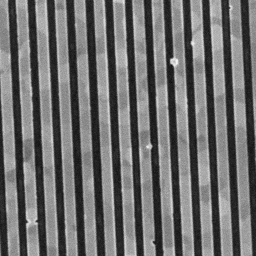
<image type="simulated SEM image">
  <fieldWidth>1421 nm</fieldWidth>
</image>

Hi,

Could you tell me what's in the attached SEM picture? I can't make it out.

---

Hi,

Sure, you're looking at parallel lines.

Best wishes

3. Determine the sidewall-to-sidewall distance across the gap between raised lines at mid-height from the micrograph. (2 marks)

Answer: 47.9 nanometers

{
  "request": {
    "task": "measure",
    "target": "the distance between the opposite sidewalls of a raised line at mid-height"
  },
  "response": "57.6 nanometers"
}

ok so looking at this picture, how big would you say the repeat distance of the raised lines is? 108 nm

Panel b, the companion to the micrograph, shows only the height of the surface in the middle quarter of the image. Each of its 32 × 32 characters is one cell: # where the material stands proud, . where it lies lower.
#..###..###..###..###..##..###..
#...##..###..###..###..##...##..
#...##..###..###..###..##...##..
#...##..###..###..###..##...##..
#...##..###..###..###..##...##..
#...##..###..###..###..###..##..
#...##...##..###..###..###..##..
#...##...##...##..###..###..##..
#...##...##...##..###..###..##..
##..##...##...##..###..###..##..
##..##...##...##..###..###..##..
##..##...##...##..###..###..###.
##..##...##...##...##..###..###.
##..##...##...##...##...##..###.
##..###..##...##...##...##..###.
##..###..##...##...##...##..###.
##..###..##...##...##...##..###.
##..###..##...##...##...##..###.
##..###..##...##...##...##..###.
##..###..##...##...##...##...##.
##..###..###..###..###..##...##.
##..###..###..###..###..##...##.
##...##..###..###..###..##...##.
##...##..###..###..###..##...##.
##...##..###..###..###..##...##.
##...##..###..###..###..##...##.
##...##..###..###..###..##...##.
##...##..###..###..###..###..##.
##...##...##...##..###..###..##.
##...##...##...##...##..###..##.
###..##...##...##...##..###..##.
###..##...##...##...##..###..##.